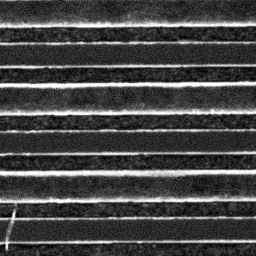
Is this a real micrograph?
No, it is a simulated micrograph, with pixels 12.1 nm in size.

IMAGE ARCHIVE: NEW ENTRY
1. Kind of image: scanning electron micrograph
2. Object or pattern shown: lines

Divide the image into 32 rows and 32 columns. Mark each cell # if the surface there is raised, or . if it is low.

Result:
################################
################################
################################
................................
................................
################################
################################
################################
................................
................................
.......................#########
################################
################################
################################
................................
................................
################################
################################
################################
................................
................................
.........................#####.#
################################
################################
################################
................................
................................
################################
################################
################################
................................
................................